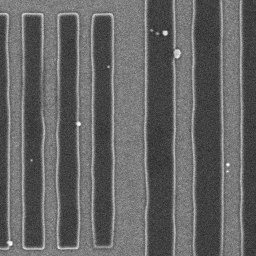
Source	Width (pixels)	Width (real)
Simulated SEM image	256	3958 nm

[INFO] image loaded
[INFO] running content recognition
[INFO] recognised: groups of lines, slits or small figures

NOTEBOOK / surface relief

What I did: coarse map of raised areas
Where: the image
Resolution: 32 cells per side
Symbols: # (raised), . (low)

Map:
..................####..####..##
..................####..####..##
#..##..###..##....####..####..##
#..##..###.###....####..####..##
#..##..###.###....####..####..##
#..##..###.###....####..####..##
#..##..###.###....####..####..##
#..##..###.###....####..####..##
#..##..###..##....####..####..##
#..##..###..##....####..####..##
#..##..###..##....####..####..##
#..##..###..##....####..####..##
#..##..###..##....####..####..##
#..##..###..##....####..####..##
#..##..###..##....####..####..##
#..##..###..##....####..####..##
#..###.###..##....####..####..##
#..###.###..##....####..####..##
#..##..###..##....####..####..##
#..##..###..##....####..####..##
#..##..###..##....####..####..##
#..##..###..##....####..####..##
#..###.###..##....####..####..##
#..###.###..##....####..####..##
#..##..###..##....####..####..##
#..##..###..##....####..####..##
#..##..###..##....####..####..##
#..##..###..##....####..####..##
#..###.###..##....####..####..##
#..###.###..##....####..####..##
#..###.###..##....####..####..##
..................####..####..##